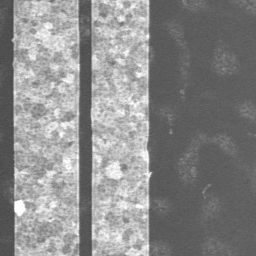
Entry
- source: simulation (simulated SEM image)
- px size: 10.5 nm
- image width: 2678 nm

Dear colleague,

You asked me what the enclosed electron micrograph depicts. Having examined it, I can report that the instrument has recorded one or a few lines or trenches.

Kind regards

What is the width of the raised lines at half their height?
0.58 microns